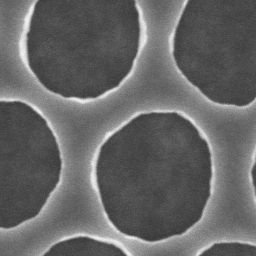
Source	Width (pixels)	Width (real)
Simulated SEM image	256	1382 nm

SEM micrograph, holes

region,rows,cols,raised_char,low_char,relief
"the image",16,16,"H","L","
HHLLLLLLLHHHLLLL
HHLLLLLLLHHLLLLL
HLLLLLLLLHHLLLLL
HHLLLLLLLHHLLLLL
HHLLLLLLHHHLLLLL
HHHLLLLHHHHHLLLL
LLHHHHHHHHHHHHLL
LLLHHHHHLLLLHHHH
LLLHHHHLLLLLLHHH
LLLLHHLLLLLLLHHH
LLLLHHLLLLLLLHHH
LLLLHHLLLLLLLHHH
LLLHHHLLLLLLLHHH
LLHHHHHLLLLLLHHH
HHHHHHHHLLLLHHHH
HHHLLLLLHHHHHLLL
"